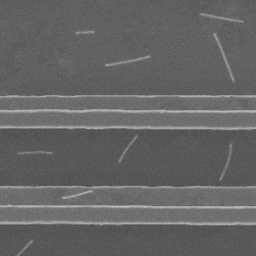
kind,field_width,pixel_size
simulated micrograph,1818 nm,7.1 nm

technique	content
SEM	lines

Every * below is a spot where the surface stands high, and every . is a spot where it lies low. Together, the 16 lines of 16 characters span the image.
................
................
................
................
................
................
****************
****************
................
................
................
................
****************
****************
................
................